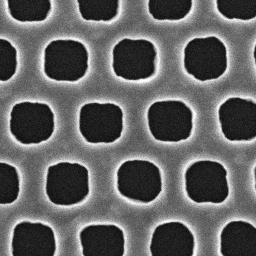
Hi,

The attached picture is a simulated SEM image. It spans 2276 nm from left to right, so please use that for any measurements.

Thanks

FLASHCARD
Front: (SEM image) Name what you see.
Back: a regular array of holes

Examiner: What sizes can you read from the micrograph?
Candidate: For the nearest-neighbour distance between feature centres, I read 615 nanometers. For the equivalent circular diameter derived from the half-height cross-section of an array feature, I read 401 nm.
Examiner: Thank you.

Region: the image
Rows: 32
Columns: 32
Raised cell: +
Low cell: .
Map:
+.....++++.....++++.....+++.....
+.....++++.....++++.....+++.....
++...++++++...+++++++.++++++++++
++++++++++++++++++++++++++++++++
++++++++++++++++++++++++++++++++
.+++++....+++++....++++.....++++
..++++.....+++......+++.....++++
..++++.....+++......+++.....++++
..+++......+++......+++.....++++
..++++....+++++....+++++....++++
++++++++++++++++++++++++++++++++
++++++++++++++++++++++++++++++++
++++++++++++++++++++++++++++...+
++....++++.....++++.....+++.....
+......+++.....+++......+++.....
+......+++.....++++.....++++....
+......+++.....++++.....++++....
++....+++++...++++++...++++++..+
++++++++++++++++++++++++++++++++
++++++++++++++++++++++++++++++++
.++++++...+++++....+++++....++++
..++++.....++++.....+++.....++++
..++++.....++++.....+++.....++++
..++++.....++++.....+++......+++
..++++.....++++.....++++....++++
.++++++..+++++++++++++++++++++++
++++++++++++++++++++++++++++++++
++++++++++++++++++++++++++++++++
++....+++++....+++++....++++....
++.....+++.....++++.....++++....
+......+++......+++.....++++....
++.....+++.....++++.....++++....